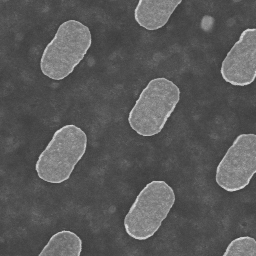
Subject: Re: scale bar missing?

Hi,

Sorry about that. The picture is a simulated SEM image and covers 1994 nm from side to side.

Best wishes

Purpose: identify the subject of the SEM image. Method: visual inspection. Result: raised bodies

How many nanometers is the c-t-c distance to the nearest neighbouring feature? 807